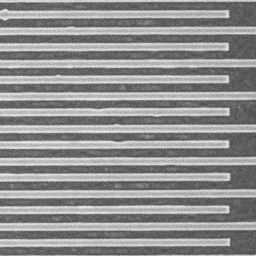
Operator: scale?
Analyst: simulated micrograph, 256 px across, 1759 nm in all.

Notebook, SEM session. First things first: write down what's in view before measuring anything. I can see parallel lines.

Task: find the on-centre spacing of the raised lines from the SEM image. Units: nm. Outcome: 112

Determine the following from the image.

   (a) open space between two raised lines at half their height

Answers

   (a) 63.6 nanometres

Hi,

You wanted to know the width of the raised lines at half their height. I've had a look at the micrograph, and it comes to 51.5 nanometers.